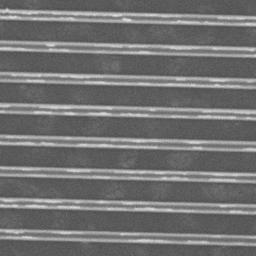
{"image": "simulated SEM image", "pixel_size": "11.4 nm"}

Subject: parallel lines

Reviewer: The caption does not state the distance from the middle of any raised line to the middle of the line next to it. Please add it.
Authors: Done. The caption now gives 31.4 px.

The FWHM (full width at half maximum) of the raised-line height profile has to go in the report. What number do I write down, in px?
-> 8.74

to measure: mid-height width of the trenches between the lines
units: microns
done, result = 0.258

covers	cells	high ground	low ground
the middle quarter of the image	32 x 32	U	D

DDDDDDDDDDDDDDDDDDDDDDDDDDDDDDDD
DDDDDDDDDDDDDDDDDDDDDDDDDDDDDDDD
DDDDDDDDDDDDDDDDDDDDDDDDDDDDDDDD
UUUUUUUUUUUUUUUUUUUUUUUUUUUDDDDD
UUUUUUUUUUUUUUUUUUUUUUUUUUUUUUUU
DDDDDDDDDDDDDDDDDDDDDDDDDDDDDUUU
DDDDDDDDDDDDDDDDDDDDDDDDDDDDDDDD
DDDDDDDDDDDDDDDDDDDDDDDDDDDDDDDD
DDDDDDDDDDDDDDDDDDDDDDDDDDDDDDDD
DDDDDDDDDDDDDDDDDDDDDDDDDDDDDDDD
DDDDDDDDDDDDDDDDDDDDDDDDDDDDDDDD
UUUUUUUUUUUUUUUUUUUUUUUUUUUUUUUU
UUUUUUUUUUUUUUUUUUUUUUUUUUUUUUUU
DDDDDDDDDDDDDDDDDDDDDDDDDDDDDDDD
DDDDDDDDDDDDDDDDDDDDDDDDDDDDDDDD
DDDDDDDDDDDDDDDDDDDDDDDDDDDDDDDD
DDDDDDDDDDDDDDDDDDDDDDDDDDDDDDDD
DDDDDDDDDDDDDDDDDDDDDDDDDDDDDDDD
UUDDDDDDDDDDDDDDDDDDDDDDDDDDDDDD
UUUUUUUUUUUUUUUUUUUUUUUUUUUUUUUU
DDDDUUUUUUUUUUUUUUUUUUUUUUUUUUUU
DDDDDDDDDDDDDDDDDDDDDDDDDDDDDDDD
DDDDDDDDDDDDDDDDDDDDDDDDDDDDDDDD
DDDDDDDDDDDDDDDDDDDDDDDDDDDDDDDD
DDDDDDDDDDDDDDDDDDDDDDDDDDDDDDDD
DDDDDDDDDDDDDDDDDDDDDDDDDDDDDDDD
UUUUUUUUDDDDDDDDDDDDDDDDDDDDDDDD
UUUUUUUUUUUUUUUUUUUUUUUUUUUUUUUU
DDDDDDDDDUUUUUUUUUUUUUUUUUUUUUUU
DDDDDDDDDDDDDDDDDDDDDDDDDDDDDDDD
DDDDDDDDDDDDDDDDDDDDDDDDDDDDDDDD
DDDDDDDDDDDDDDDDDDDDDDDDDDDDDDDD